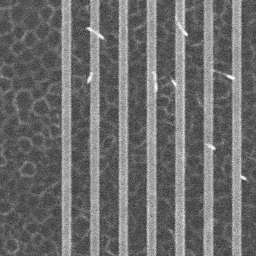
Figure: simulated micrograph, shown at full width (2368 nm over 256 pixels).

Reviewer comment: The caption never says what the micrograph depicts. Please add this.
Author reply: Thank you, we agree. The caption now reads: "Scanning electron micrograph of parallel lines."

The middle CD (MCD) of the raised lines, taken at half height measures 70.5 nm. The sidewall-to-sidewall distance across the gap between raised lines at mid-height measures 188 nanometers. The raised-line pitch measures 263 nm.